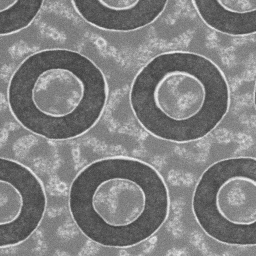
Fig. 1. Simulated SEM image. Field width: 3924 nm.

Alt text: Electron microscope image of ring-shaped grooves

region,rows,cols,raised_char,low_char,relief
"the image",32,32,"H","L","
HHLLLHHHHLLLLHHHHLLLLHHHLLLLHHHH
LLLLLHHHHHLLLLLLLLLLHHHHHLLLLHHL
LLLLHHHHHHHLLLLLLLLHHHHHHHLLLLLL
LLLHHHHHHHHHHLLLLHHHHHHHHHHLLLLL
HHHHHHHHHHHHHHHHHHHHHHHHHHHHHHHH
HHHHHHHHHHHHHHHHHHHHHHHHHHHHHHHH
HHHHHLLLLHHHHHHHHHHHHHHHHHHHHHHH
HHHLLLLLLLLHHHHHHHHLLLLLLLHHHHHH
HHLLLLLLLLLLHHHHHHLLLLLLLLLHHHHH
HHLLLHHHHLLLLHHHHLLLLHHHLLLLHHHH
HLLLHHHHHHLLLHHHHLLLHHHHHLLLHHHH
HLLLHHHHHHLLLHHHLLLHHHHHHHLLLHHH
HLLLHHHHHHLLLHHHLLLHHHHHHLLLLHHH
HLLLLHHHHLLLLHHHHLLLHHHHHLLLLHHH
HHLLLLHHLLLLLHHHHLLLLHHHLLLLHHHH
HHHLLLLLLLLLHHHHHHLLLLLLLLLHHHHH
HHHHLLLLLLHHHHHHHHHLLLLLLLHHHHHH
HHHHHHHHHHHHHHHHHHHHHLLLHHHHHHHH
HHHHHHHHHHHHHHHHHHHHHHHHHHHHHHHH
HHHHHHHHHHHHHHHHHHHHHHHHHHHHHHHH
LLHHHHHHHHHLLLLLLLHHHHHHHHHLLLLL
LLLLHHHHHHLLLLLLLLLLHHHHHHLLLLLL
LLLLLHHHHLLLLLHHLLLLHHHHHLLLLHHL
HHLLLHHHHLLLHHHHHHLLLHHHHLLLHHHH
HHHLLLHHHLLLHHHHHHLLLHHHLLLHHHHH
HHHLLLHHHLLLHHHHHHLLLHHHLLLHHHHH
HHLLLLHHHLLLHHHHHHLLLHHHLLLHHHHH
HHLLLHHHHLLLLHHHHLLLLHHHHLLLLHHH
LLLLHHHHHHLLLLLLLLLLHHHHHLLLLLLL
LLLLHHHHHHHLLLLLLLLHHHHHHHLLLLLL
LLHHHHHHHHHHHLLLLHHHHHHHHHHHHLLL
HHHHHHHHHHHHHHHHHHHHHHHHHHHHHHHH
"